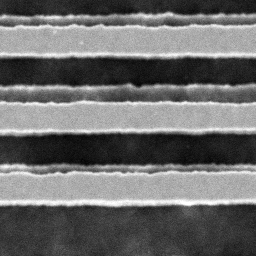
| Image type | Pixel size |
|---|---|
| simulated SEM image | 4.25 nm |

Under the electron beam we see lines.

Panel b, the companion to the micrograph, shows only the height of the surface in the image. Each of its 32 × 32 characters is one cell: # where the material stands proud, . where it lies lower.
................................
................................
################################
################################
################################
################################
################################
................................
................................
................................
................................
################################
################################
################################
################################
################################
######.######...................
................................
................................
................................
................................
################################
################################
################################
################################
................................
................................
................................
................................
................................
................................
................................